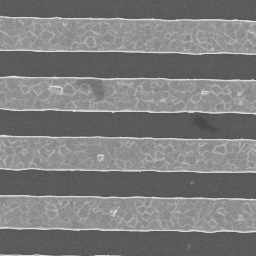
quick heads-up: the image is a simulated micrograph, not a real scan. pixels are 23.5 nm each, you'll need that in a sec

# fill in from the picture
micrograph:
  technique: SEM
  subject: wiring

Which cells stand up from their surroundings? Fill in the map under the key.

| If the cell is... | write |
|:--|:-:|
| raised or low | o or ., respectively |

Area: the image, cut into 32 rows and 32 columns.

................................
................................
oooooooooooooooooooo............
oooooooooooooooooooooooooooooooo
oooooooooooooooooooooooooooooooo
oooooooooooooooooooooooooooooooo
...................ooooooooooooo
................................
................................
................................
oooooooooooooooooooooooooooooooo
oooooooooooooooooooooooooooooooo
oooooooooooooooooooooooooooooooo
oooooooooooooooooooooooooooooooo
................................
................................
................................
ooooooooooooooooooooooooooooo...
oooooooooooooooooooooooooooooooo
oooooooooooooooooooooooooooooooo
oooooooooooooooooooooooooooooooo
................................
................................
................................
oooo............................
oooooooooooooooooooooooooooooooo
oooooooooooooooooooooooooooooooo
oooooooooooooooooooooooooooooooo
oooooooooooooooooooooooooooooooo
................................
................................
................................